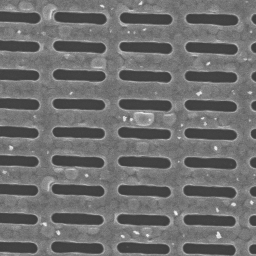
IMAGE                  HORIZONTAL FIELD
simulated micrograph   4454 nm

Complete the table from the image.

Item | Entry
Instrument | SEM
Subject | a regular array of holes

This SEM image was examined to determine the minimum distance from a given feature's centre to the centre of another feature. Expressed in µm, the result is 0.498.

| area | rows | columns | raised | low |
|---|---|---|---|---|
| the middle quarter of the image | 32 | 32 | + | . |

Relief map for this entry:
++++++++++++++++++++++++++++++++
....++++++++++..++++++++++++++++
..........++++............++++..
..........++++.............+++..
+++++++..+++++++++++++++..++++++
++++++++++++++++++++++++++++++++
++++++++++++++++++++++++++++++++
++++++++++++++++++++++++++++++++
++++++++++++++++++++++++++++++++
..........++++.............+++..
..........++++.............+++..
+++.......++++++++........+++++.
++++++++++++++++++++++++++++++++
++++++++++++++++++++++++++++++++
++++++++++++++++++++++++++++++++
++++++++++++++++++++++++++++++++
..........++++............++++..
..........++++.............+++..
..........+++++.++.........++++.
++++++++++++++++++++++++++++++++
++++++++++++++++++++++++++++++++
++++++++++++++++++++++++++++++++
++++++++++++++++++++++++++++++++
.........+++++............++++..
..........+++.............++++..
..........++++++..........+++++.
++++++++++++++++++++++++++++++++
++++++++++++++++++++++++++++++++
++++++++++++++++++++++++++++++++
++++++++++++++++++++++++++++++++
.........+++++...........+++++..
..........+++..............+++..